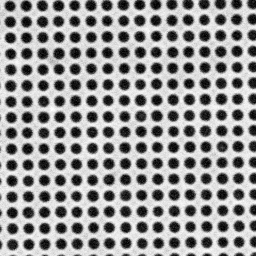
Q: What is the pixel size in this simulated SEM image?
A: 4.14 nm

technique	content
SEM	a regular array of holes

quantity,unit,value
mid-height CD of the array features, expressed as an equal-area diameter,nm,50.9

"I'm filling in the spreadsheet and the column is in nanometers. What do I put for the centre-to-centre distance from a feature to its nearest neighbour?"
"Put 65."